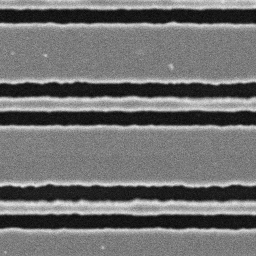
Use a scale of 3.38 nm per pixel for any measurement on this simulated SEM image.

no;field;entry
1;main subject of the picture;lines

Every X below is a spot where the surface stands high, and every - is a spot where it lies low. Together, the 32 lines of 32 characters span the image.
XXXXXXXXXXXXXXXXXXXXXXXXXXXXXXXX
--------------------------------
--------------------------------
XXXXXXXXXXXXXXXXXXXXXXXXXXXXXXXX
XXXXXXXXXXXXXXXXXXXXXXXXXXXXXXXX
XXXXXXXXXXXXXXXXXXXXXXXXXXXXXXXX
XXXXXXXXXXXXXXXXXXXXXXXXXXXXXXXX
XXXXXXXXXXXXXXXXXXXXXXXXXXXXXXXX
XXXXXXXXXXXXXXXXXXXXXXXXXXXXXXXX
XXXXXXXXXXXXXXXXXXXXXXXXXXXXXXXX
--------------------------X-----
--------------------------------
XXXXXXXXXXXXXXXXXXXXXXXXXXXXXXXX
XXXXXXXXXXXXXXXXXXXXXXXXXXXXXXXX
--------------------------------
--------------------------------
XXXXXXXXXXXXXXXXXXXXXXXXXXXXXXXX
XXXXXXXXXXXXXXXXXXXXXXXXXXXXXXXX
XXXXXXXXXXXXXXXXXXXXXXXXXXXXXXXX
XXXXXXXXXXXXXXXXXXXXXXXXXXXXXXXX
XXXXXXXXXXXXXXXXXXXXXXXXXXXXXXXX
XXXXXXXXXXXXXXXXXXXXXXXXXXXXXXXX
XXXXXXXXXXXXXXXXXXXXXXXXXXXXXXXX
--------------------------------
--------------------------------
XXXXXXXXXXXXXXXXXXXXXXXXXXXXXXXX
XXXXXXXXXXXXXXXXXXXXXXXXXXXXXXXX
--------------------------------
-X-----------------X------------
XXXXXXXXXXXXXXXXXXXXXXXXXXXXXXXX
XXXXXXXXXXXXXXXXXXXXXXXXXXXXXXXX
XXXXXXXXXXXXXXXXXXXXXXXXXXXXXXXX